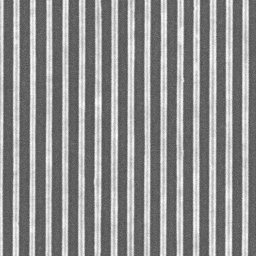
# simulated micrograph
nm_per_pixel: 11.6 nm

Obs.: parallel lines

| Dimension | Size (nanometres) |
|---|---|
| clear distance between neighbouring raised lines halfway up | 137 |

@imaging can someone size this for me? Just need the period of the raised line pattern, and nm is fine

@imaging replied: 190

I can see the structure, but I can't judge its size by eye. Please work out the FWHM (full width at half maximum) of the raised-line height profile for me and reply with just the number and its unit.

4.25 pixels